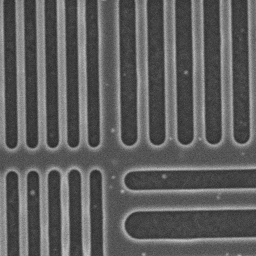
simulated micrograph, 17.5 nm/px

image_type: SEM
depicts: groups of lines, slits or small figures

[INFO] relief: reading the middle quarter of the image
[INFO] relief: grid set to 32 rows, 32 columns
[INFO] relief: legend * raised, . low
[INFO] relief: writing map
....*....*****....***....***....
....*....*****....***....***....
....**...*****....***....***....
....**...*****.....**....***....
....**...*****.....**....***....
....**...*****.....**....***....
....**...*****.....**....***....
....**...*****.....**....***....
....**...*****.....**.....**....
....**...*****.....**.....**....
....**...*****.....**.....**....
*...**...*****.....**.....**....
*...**...*****.....**.....**....
*...**...*****.....**.....**....
*...**...*****.....**.....**....
*...**...*****.....**.....**....
*...**...*****.....**.....**....
*...**...*****.....**.....**....
*...**...*****.....**.....**....
*...**...*****....****...****...
*..***...***********************
********************************
********************************
********************************
********************************
********************************
**.*****************............
*...**...*******................
*...**....*****.................
*...**....*****.................
*...**....******................
*....*....*******..........**...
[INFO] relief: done